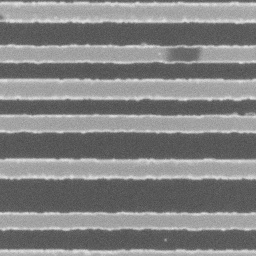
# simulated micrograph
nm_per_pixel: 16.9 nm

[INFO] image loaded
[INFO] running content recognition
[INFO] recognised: lines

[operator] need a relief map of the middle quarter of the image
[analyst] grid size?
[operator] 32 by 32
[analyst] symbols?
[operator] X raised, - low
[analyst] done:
--------------------------------
--------------------------------
--------------------------------
--------------------------------
XXXXXXXXXXXXXXXXXXXXXXXXXXXXXXXX
XXXXXXXXXXXXXXXXXXXXXXXXXXXXXXXX
XXXXXXXXXXXXXXXXXXXXXXXXXXXXXXXX
XXXXXXXXXXXXXXXXXXXXXXXXXXXXXXXX
XXXXXXXXXXXXXXXXXXXXXXXXXXXXXXXX
--------------------------------
--------------------------------
--------------------------------
--------------------------------
XXXXXXXXXXXXXXXXXXXXXXXXXXXXXXXX
XXXXXXXXXXXXXXXXXXXXXXXXXXXXXXXX
XXXXXXXXXXXXXXXXXXXXXXXXXXXXXXXX
XXXXXXXXXXXXXXXXXXXXXXXXXXXXXXXX
--------------------------------
--------------------------------
--------------------------------
--------------------------------
--------------------------------
--------------------------------
--------------------------------
XXXXXXXXXXXXXXXXXXXXXXXXXXXXXXXX
XXXXXXXXXXXXXXXXXXXXXXXXXXXXXXXX
XXXXXXXXXXXXXXXXXXXXXXXXXXXXXXXX
XXXXXXXXXXXXXXXXXXXXXXXXXXXXXXXX
-----XX------------X------------
--------------------------------
--------------------------------
--------------------------------